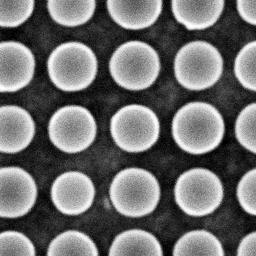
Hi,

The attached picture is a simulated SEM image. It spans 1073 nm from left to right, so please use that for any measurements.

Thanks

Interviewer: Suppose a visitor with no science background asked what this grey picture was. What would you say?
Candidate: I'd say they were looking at a regular array of raised bodies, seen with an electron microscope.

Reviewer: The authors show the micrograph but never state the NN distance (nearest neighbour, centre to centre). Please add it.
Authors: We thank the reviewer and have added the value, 261 nm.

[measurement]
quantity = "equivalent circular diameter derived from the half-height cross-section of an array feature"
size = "198 nanometers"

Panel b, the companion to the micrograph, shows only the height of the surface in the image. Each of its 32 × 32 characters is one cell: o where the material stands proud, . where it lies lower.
oooo..oooooo.ooooooo..oooooo..oo
oooo..oooooo..oooooo..oooooo..oo
ooo....oooo...ooooo...ooooo....o
................o......ooo......
................................
oo.......o......oo......oo.....o
oooo...oooo...ooooo...ooooo...oo
oooo..oooooo..oooooo..oooooo..oo
oooo..oooooo..oooooo..oooooo.ooo
oooo..oooooo..oooooo..ooooo...oo
ooo....oooo....oooo....ooo....oo
................................
................................
oo......oo......oo.....oooo....o
oooo...oooo...ooooo...ooooo...oo
oooo..oooooo..oooooo..oooooo..oo
oooo..oooooo..oooooo..oooooo..oo
oooo...ooooo..ooooo...ooooo...oo
ooo....oooo....ooo.....oooo....o
................................
................................
ooo............ooo......oo.....o
oooo...oooo...ooooo...ooooo...oo
oooo...ooooo..oooooo..oooooo..oo
oooo...ooooo..oooooo..oooooo..oo
oooo...oooo...ooooo...ooooo...oo
ooo.....oo.....oooo....ooo.....o
................................
................................
ooo....oooo....oooo....oooo....o
oooo..oooooo..oooooo..ooooo...oo
oooo..oooooo..oooooo..oooooo..oo